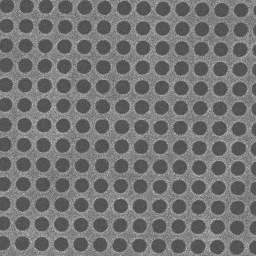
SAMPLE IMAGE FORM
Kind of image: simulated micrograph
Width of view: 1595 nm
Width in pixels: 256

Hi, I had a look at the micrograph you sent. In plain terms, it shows a regular array of holes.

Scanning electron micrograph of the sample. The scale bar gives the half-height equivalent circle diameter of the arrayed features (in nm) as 90.1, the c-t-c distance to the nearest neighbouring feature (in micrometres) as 0.121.